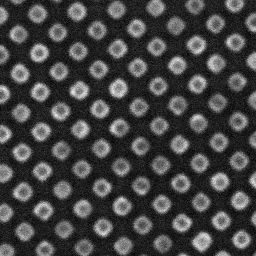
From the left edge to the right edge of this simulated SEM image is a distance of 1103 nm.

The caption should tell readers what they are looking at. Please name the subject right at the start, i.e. a regular array of raised bodies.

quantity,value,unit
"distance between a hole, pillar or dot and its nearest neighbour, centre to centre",27.5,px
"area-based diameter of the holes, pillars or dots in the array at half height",68.5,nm